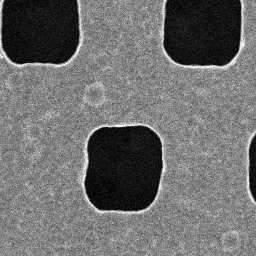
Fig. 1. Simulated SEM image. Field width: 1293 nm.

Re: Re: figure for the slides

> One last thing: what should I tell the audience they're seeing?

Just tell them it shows holes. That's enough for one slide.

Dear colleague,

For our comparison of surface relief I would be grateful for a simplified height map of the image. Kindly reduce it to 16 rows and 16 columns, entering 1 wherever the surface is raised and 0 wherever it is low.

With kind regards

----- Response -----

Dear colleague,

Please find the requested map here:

0000011111000001
0000011111000001
0000011111000001
0000011111100001
1111111111111111
1111111111111111
1111111111111111
1111111111111111
1111110000111111
1111100000111111
1111100000111111
1111100000111111
1111110000111111
1111111111111111
1111111111111111
1111111111111111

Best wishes